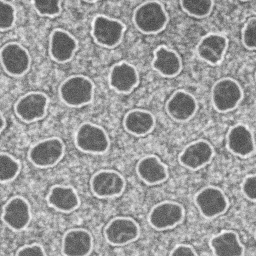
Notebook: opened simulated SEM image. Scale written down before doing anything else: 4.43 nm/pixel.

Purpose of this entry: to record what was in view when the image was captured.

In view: a regular array of raised bodies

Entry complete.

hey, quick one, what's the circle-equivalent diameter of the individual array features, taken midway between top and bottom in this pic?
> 31.4 px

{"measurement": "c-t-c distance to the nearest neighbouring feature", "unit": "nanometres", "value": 209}